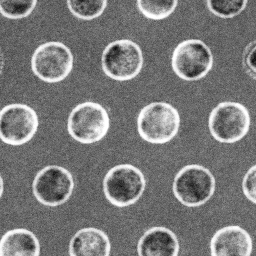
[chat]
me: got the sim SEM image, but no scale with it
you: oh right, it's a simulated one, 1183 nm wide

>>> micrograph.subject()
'a regular array of raised bodies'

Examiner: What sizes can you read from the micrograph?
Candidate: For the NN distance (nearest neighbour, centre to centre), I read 324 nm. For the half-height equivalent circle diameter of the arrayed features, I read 0.176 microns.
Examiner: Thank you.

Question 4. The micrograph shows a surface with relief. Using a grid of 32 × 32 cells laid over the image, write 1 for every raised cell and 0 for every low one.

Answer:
11110000011110000111110000111110
11110000011110000011100000011100
00000000000000000000000000000000
00000000000000000000000000000000
00000000000000000000000000000000
00000000000000111000000110000000
00000111100001111000001111000001
00001111100001111100001111000001
00001111100001111000001111000000
00000111000000110000000110000000
00000000000000000000000000000000
00000000000000000000000000000000
00000000000000000000000000000000
01100000001100000011100000011100
11110000011110000011110000011110
11110000011110000111110000111110
11110000011110000011110000011110
01100000001100000001100000001000
00000000000000000000000000000000
00000000000000000000000000000000
00000000000000000000000000000000
00000111000000111000000111000001
00001111100001111100001111100001
00001111100001111100001111100001
00000111000000111000001111000001
00000010000000010000000110000000
00000000000000000000000000000000
00000000000000000000000000000000
00000000000000000000000000000000
01110000011110000011110000011110
11111000011110000011110000011110
11111000011110000011110000011110